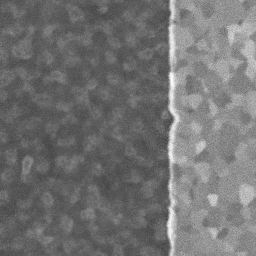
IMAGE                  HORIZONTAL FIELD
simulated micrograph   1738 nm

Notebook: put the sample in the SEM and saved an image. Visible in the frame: one or a few lines or trenches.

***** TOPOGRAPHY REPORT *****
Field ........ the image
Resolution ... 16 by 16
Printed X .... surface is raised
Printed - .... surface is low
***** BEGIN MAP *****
-----------XXXXX
-----------XXXXX
-----------XXXXX
-----------XXXXX
-----------XXXXX
-----------XXXXX
-----------XXXXX
-----------XXXXX
-----------XXXXX
-----------XXXXX
-----------XXXXX
-----------XXXXX
-----------XXXXX
-----------XXXXX
-----------XXXXX
-----------XXXXX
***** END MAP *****